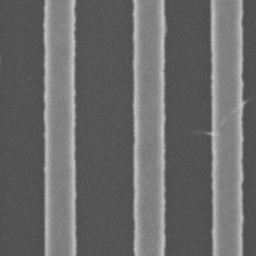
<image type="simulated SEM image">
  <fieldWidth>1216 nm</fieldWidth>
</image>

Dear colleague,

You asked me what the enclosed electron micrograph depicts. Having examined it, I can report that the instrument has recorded lines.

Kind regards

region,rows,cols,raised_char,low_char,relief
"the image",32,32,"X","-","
------XXX--------XXX------XXXX--
------XXX--------XXX------XXXX--
------XXX--------XXXX-----XXXX--
------XXX--------XXX------XXXX--
------XXX--------XXX------XXXX--
------XXX--------XXX------XXXX--
------XXX--------XXX------XXXX--
------XXX--------XXXX-----XXXX--
------XXX--------XXX-------XXX--
------XXX--------XXX------XXXX--
------XXX--------XXXX-----XXXX--
------XXX--------XXX------XXXX--
------XXX--------XXX-------XXX--
------XXX--------XXXX------XXX--
------XXX--------XXXX------XXX--
------XXX--------XXXX------XXX--
------XXX--------XXX------XXXX--
------XXX--------XXX-------XXX--
------XXX--------XXXX------XXX--
------XXX--------XXXX------XXX--
------XXX--------XXXX------XXX--
------XXX--------XXXX------XXX--
------XXX--------XXX-------XXX--
------XXX--------XXXX------XXX--
------XXX--------XXXX------XXX--
------XXX--------XXXX------XXX--
------XXX--------XXXX------XXX--
------XXX--------XXX-------XXX--
------XXX--------XXXX------XXX--
------XXX--------XXXX------XXX--
------XXX--------XXXX------XXX--
------XXX--------XXX-------XXX--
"